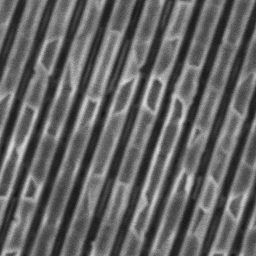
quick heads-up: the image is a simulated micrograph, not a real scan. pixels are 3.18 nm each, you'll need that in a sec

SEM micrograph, parallel lines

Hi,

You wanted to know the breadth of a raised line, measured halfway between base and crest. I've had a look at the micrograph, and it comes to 57.2 nm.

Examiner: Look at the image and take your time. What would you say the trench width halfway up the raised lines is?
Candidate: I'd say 33.1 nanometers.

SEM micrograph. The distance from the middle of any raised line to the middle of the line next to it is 89.3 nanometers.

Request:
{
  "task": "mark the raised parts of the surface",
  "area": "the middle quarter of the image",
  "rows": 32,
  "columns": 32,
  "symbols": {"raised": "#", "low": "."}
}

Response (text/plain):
#####...####...#####..#####...##
#####..#####...####...#####...##
####...####....####...#####..###
####...####...#####..#####...###
####..#####...####...#####..####
###...####....####...#####..####
###...####...#####..#####...####
###...####...####...#####..#####
##...####...#####...#####..#####
##...####...#####...####...#####
##...####...####...#####..#####.
#...####...#####...#####..#####.
#...####...#####...####...#####.
....####...####...#####...####..
...####...#####...#####..#####..
...####...#####..#####...#####..
..#####...####...#####...####...
..#####..#####...####...#####...
..####...#####...####...#####..#
.#####...####...#####..#####...#
.#####..#####...####...#####...#
.####...#####...####...####...##
#####...####...#####..#####...##
#####..#####...####...#####...##
####...#####..#####...####....##
####..#####...#####...####...###
####..#####...####...#####...###
###...#####...####...####....###
###..#####...#####...####...####
##...#####...####...#####...####
##...#####..#####...####...#####
##..#####...#####...####...#####